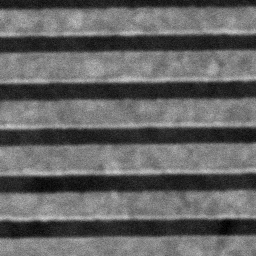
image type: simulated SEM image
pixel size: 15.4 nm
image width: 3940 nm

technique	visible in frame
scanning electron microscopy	lines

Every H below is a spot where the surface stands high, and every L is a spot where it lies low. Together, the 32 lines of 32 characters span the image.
LLLLLLLLLLLLLLLLLLLLLLLLLLLLLLLL
HHHHHHHHHHHHHHHHHHHHHHHHHHHHHHHH
HHHHHHHHHHHHHHHHHHHHHHHHHHHHHHHH
HHHHHHHHHHHHHHHHHHHHHHHHHHHHHHHH
LLLLLLLLLLLLLLLLLLLLLLLLLLLLLLLL
LLLLLLLLLLLLLLLLLLLLLLLLLLLLLLLL
LLLLLLLLLLLLLLLLLLLLLLLLLLLLLHHH
HHHHHHHHHHHHHHHHHHHHHHHHHHHHHHHH
HHHHHHHHHHHHHHHHHHHHHHHHHHHHHHHH
HHHHHHHHHHHHHHHHHHHHHHHHHHHHHHHH
LLLLLLLLLLLLLLLLLLLLLLLLLLLLLLLL
LLLLLLLLLLLLLLLLLLLLLLLLLLLLLLLL
LLLLLLLLLLLLLLLHHLLHHHHHHHHHHHHH
HHHHHHHHHHHHHHHHHHHHHHHHHHHHHHHH
HHHHHHHHHHHHHHHHHHHHHHHHHHHHHHHH
HHHHHHHHHHHHHHHHHHHHHHHHHHHHHHHH
LLLLLLLLLLLLLLLLLLLLLLLLLLLLLLLL
LLLLLLLLLLLLLLLLLLLLLLLLLLLLLLLL
HHHHHHHHHHHHHHHHHHHHHHHHHHHHHHHH
HHHHHHHHHHHHHHHHHHHHHHHHHHHHHHHH
HHHHHHHHHHHHHHHHHHHHHHHHHHHHHHHH
HHHHHHHHHHHHHHHHHHHHHHHHHHHHHHHL
LLLLLLLLLLLLLLLLLLLLLLLLLLLLLLLL
LLLLLLLLLLLLLLLLLLLLLLLLLLLLLLLL
HHHHHHHHHHHHHHHHHHHHHHHHHHHHHHHH
HHHHHHHHHHHHHHHHHHHHHHHHHHHHHHHH
HHHHHHHHHHHHHHHHHHHHHHHHHHHHHHHH
LLLLLLLLLLLLLLLLLLLLLLLLLLLLLLLL
LLLLLLLLLLLLLLLLLLLLLLLLLLLLLLLL
LLLLLLLLLLLLLLLLLLLLLLLLLLLLLLLL
HHHHHHHHHHHHHHHHHHHHHHHHHHHHHHHH
HHHHHHHHHHHHHHHHHHHHHHHHHHHHHHHH